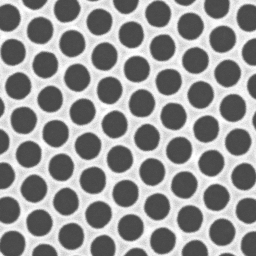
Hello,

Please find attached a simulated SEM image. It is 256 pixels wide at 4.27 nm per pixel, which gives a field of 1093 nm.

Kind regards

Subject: a regular array of holes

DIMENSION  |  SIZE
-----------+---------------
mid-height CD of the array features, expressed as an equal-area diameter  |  117 nm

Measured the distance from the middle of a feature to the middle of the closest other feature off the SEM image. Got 34.2 pixels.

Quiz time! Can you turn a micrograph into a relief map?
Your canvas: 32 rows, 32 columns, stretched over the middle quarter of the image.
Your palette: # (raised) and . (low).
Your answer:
#....###.....##.......########..
#.....###..####.......###...##..
.......########......##......###
.......###...##......##......###
.......##.....###..####.......##
#.....##.......########......###
##...###.......###...##......##.
########.......##.....##....###.
#########.....###......########.
##.....##....###.......########.
##......########.......##.....##
#.......########.......#......##
#.......###....##.....##.......#
##.....###......########.......#
##.....##.......########.......#
.########.......###....##.....##
.#########......##.....####..###
.####...##.....###......########
.##......###..###.......####...#
.##......#########......##......
###......####..###......##......
###......##......##...###.......
###......##......########.......
..##....###......####.####......
..#########......###....###...##
...########......##......#######
...##.....##....###......#######
..##......#########......###....
..##.......########......##.....
####.......###...###....###.....
####......###.....###..####.....
..###.....##.......########.....